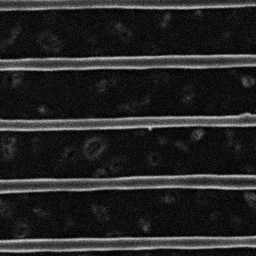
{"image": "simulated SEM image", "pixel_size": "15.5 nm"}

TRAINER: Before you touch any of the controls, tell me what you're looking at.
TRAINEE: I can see parallel lines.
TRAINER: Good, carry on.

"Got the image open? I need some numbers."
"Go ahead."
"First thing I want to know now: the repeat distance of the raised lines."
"936 nm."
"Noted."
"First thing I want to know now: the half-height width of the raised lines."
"169 nm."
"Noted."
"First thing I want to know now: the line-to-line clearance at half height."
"774 nanometers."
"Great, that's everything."